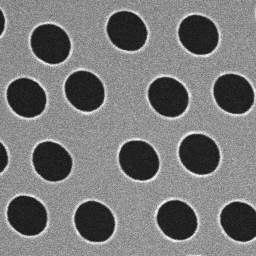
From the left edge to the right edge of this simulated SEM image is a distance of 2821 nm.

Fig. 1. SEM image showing a regular array of holes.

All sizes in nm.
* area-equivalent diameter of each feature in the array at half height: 445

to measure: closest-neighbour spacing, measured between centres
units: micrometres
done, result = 0.671